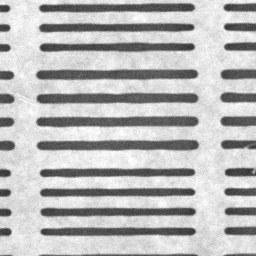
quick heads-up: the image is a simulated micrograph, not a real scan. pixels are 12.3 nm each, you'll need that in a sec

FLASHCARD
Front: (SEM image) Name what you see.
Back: groups of lines, slits or small figures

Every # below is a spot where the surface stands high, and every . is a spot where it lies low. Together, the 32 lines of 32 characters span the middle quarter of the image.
################################
................................
................................
................................
################################
################################
################################
................................
................................
................................
################################
################################
################################
................................
................................
................................
################################
################################
################################
................................
................................
................................
################################
################################
################################
################################
................................
................................
....############################
################################
################################
................................